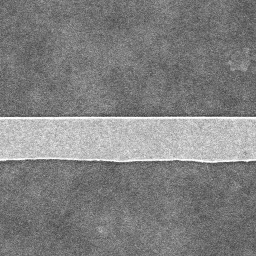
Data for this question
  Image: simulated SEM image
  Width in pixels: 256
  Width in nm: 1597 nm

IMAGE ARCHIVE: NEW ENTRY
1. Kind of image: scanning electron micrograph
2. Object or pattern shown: one or a few lines or trenches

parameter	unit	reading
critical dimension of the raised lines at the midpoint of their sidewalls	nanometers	264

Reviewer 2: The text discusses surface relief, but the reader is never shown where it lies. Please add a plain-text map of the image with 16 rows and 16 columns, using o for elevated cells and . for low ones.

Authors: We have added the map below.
................
................
................
................
................
................
................
oooooooooooooooo
oooooooooooooooo
oooooooooooooooo
................
................
................
................
................
................